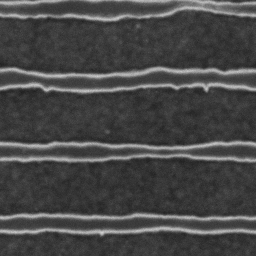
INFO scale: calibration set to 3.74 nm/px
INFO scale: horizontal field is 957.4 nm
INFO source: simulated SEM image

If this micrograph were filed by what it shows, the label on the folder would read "one or a few lines or trenches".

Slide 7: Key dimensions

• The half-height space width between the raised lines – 0.215 µm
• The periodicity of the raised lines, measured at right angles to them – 71.5 pixels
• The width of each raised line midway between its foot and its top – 55.6 nm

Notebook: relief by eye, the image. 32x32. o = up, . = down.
ooooooooooooooooooooooooooooo.oo
oooooooooooooooooooooo.....ooooo
................................
................................
................................
................................
................................
................................
................................
oooooooooooooooooooooooooooooooo
oooooooooooooooooooooooooooooooo
................................
................................
................................
................................
................................
................................
................................
oooooooooooooooooooooooooooooooo
oooooooooooooooooo.ooo.ooooooooo
................................
................................
................................
................................
................................
................................
................................
oooooooooooooooooooooooooooooooo
oooooooooooooooooooooooooooooooo
................................
................................
................................